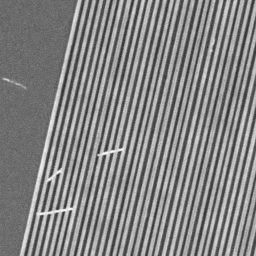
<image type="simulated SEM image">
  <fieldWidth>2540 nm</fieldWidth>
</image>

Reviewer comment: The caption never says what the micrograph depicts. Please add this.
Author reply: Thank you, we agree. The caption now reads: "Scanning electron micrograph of parallel lines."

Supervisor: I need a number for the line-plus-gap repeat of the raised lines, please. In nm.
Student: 68.4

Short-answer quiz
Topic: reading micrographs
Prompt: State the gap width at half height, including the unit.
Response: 40 nanometers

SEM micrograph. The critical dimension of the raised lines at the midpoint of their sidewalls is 30.3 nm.